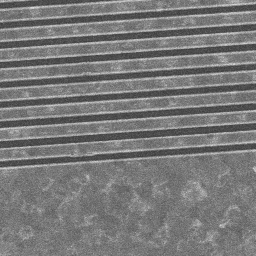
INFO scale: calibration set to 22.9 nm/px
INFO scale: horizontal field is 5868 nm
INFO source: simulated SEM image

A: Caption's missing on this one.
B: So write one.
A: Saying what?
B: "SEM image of parallel lines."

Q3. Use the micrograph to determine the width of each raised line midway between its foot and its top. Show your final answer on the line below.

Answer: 246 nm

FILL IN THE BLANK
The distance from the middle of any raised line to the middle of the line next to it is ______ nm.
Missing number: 454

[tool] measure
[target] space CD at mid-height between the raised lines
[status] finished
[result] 203 nm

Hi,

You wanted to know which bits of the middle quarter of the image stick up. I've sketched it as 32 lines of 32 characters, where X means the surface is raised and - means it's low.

XXXXXXXXXXXXXXXXXXXXXXXXXXXXXXXX
XXXXXXXXXXXXXXXXXXXX------------
XXXXXX--------------------------
--------------------------XXXXXX
------------XXXXXXXXXXXXXXXXXXXX
XXXXXXXXXXXXXXXXXXXXXXXXXXXXXXXX
XXXXXXXXXXXXXXXXXXX-------------
XXXXX---------------------------
------------------------XXXXXXXX
----------XXXXXXXXXXXXXXXXXXXXXX
XXXXXXXXXXXXXXXXXXXXXXXXXXXXXXX-
XXXXXXXXXXXXXXXXX---------------
XXX-----------------------------
--------------------------XXXXXX
------------XXXXXXXXXXXXXXXXXXXX
XXXXXXXXXXXXXXXXXXXXXXXXXXXXXXXX
XXXXXXXXXXXXXXXXXXX-------------
XXXXX---------------------------
-------------------------XXXXXXX
-----------XXXXXXXXXXXXXXXXXXXXX
XXXXXXXXXXXXXXXXXXXXXXXXXXXXXXXX
XXXXXXXXXXXXXXXXXX--------------
XXXXXXX-------------------------
------------------------XXXXXXXX
----------XXXXXXXXXXXXXXXXXXXXXX
XXXXXXXXXXXXXXXXXXXXXXXXXXXXXXXX
XXXXXXXXXXXXXXXXXXXXXXXXXXXXXXXX
XXXXXXXXXXXXXXXXXXXXXXXXXXXXXXXX
XXXXXXXXXXXXXXXXXXXXXXXXXXXXXXXX
XXXXXXXXXXXXXXXXXXXXXXXXXXXXXXXX
XXXXXXXXXXXXXXXXXXXXXXXXXXXXXXXX
XXXXXXXXXXXXXXXXXXXXXXXXXXXXXXXX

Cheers